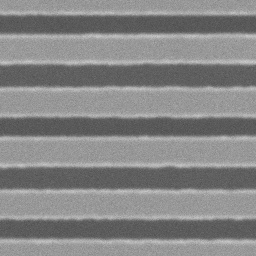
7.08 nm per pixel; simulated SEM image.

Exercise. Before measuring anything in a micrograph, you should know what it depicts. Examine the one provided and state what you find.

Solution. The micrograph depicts lines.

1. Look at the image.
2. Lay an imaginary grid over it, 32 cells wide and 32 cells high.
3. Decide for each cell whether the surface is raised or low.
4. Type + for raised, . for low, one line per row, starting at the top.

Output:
++++++++++++++++++++++++++++++++
++++++++++++++++++++++++++++++++
................................
................................
.+++++..++++++++++++++++++++++++
++++++++++++++++++++++++++++++++
++++++++++++++++++++++++++++++++
++++++++++++++++++++++++++++++++
................................
................................
................................
++++++++++++++++++++++++++++++++
++++++++++++++++++++++++++++++++
++++++++++++++++++++++++++++++++
.+.........+...+++++.++++.....++
................................
................................
++++++++++++++++++++++++++++++++
++++++++++++++++++++++++++++++++
++++++++++++++++++++++++++++++++
++++++++++++++++++++++++++++++++
................................
................................
................................
++++++++++++++++++++++++++++++++
++++++++++++++++++++++++++++++++
++++++++++++++++++++++++++++++++
................................
................................
................................
++++++++++++++++++++++++++++++++
++++++++++++++++++++++++++++++++